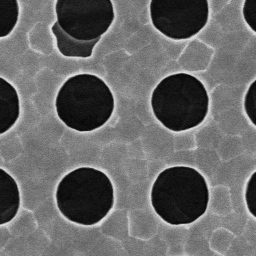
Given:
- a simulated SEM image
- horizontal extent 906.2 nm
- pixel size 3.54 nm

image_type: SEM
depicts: holes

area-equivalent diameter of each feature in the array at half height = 203 nm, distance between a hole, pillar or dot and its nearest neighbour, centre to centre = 330 nm